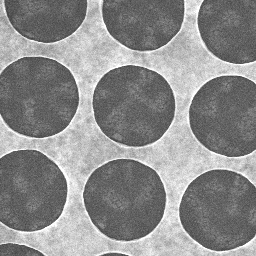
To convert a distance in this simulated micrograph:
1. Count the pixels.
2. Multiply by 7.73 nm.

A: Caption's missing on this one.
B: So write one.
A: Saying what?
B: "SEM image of holes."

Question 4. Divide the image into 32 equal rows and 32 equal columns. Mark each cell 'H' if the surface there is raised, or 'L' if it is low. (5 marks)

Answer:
HLLLLLLLLLLHHLLLLLLLLLLHHLLLLLLL
HLLLLLLLLLLHHLLLLLLLLLLHHLLLLLLL
HLLLLLLLLLHHHLLLLLLLLLLHHLLLLLLL
HHLLLLLLLLHHHLLLLLLLLLLHHLLLLLLL
HHHLLLLLLHHHHHLLLLLLLLHHHLLLLLLL
HHHHHHHHHHHHHHHLLLLLLHHHHHLLLLLL
HHHHHHHHHHHHHHHHHHHHHHHHHHLLLLLL
HHLLLLLHHHHHHHHHHHHHHHHHHHHHLLLL
HLLLLLLLHHHHHHHLLLHHHHHHHHHHHHHH
LLLLLLLLLHHHHLLLLLLLHHHHHHHHLLHH
LLLLLLLLLLHHLLLLLLLLLHHHHHLLLLLL
LLLLLLLLLLHHLLLLLLLLLLHHHLLLLLLL
LLLLLLLLLLHHLLLLLLLLLLHHLLLLLLLL
LLLLLLLLLLHHLLLLLLLLLLHHLLLLLLLL
LLLLLLLLLHHHLLLLLLLLLLHHLLLLLLLL
HLLLLLLLLHHHLLLLLLLLLHHHLLLLLLLL
HHLLLLLLHHHHHLLLLLLLLHHHLLLLLLLL
HHHHHHHHHHHHHHLLLLLLHHHHHLLLLLLL
HHHHHHHHHHHHHHHHHHHHHHHHHHLLLLLL
LLLLLLHHHHHHHHHHHHHHHHHHHHHHLLHH
LLLLLLLHHHHHHLLLLLHHHHHHHHHHHHHH
LLLLLLLLHHHHLLLLLLLLHHHHHHLLLHHH
LLLLLLLLHHHLLLLLLLLLHHHHLLLLLLLH
LLLLLLLLHHHLLLLLLLLLLHHLLLLLLLLL
LLLLLLLLHHLLLLLLLLLLLHHLLLLLLLLL
LLLLLLLLHHHLLLLLLLLLLHLLLLLLLLLL
LLLLLLLLHHHLLLLLLLLLLHLLLLLLLLLL
LLLLLLLHHHHLLLLLLLLLHHHLLLLLLLLL
HLLLLLHHHHHHLLLLLLLHHHHLLLLLLLLL
HHHHHHHHHHHHHLLLLLHHHHHHLLLLLLLL
LLHHHHHHHHHHHHHHHHHHHHHHHLLLLLLH
LLLLLHHHHHHHHHHHHHHHHHHHHHHHHHHH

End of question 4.